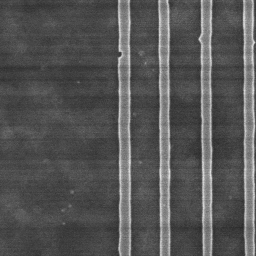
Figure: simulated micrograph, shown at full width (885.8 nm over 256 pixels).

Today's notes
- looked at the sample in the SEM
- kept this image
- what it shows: parallel lines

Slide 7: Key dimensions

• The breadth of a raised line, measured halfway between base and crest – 9.62 pixels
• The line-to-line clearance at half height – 113 nm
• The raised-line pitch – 143 nm